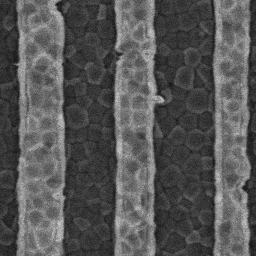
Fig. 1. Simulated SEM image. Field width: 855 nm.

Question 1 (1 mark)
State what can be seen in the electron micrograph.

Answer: one or a few lines or trenches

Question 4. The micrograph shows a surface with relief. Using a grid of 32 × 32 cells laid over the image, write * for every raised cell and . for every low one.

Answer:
..*****........****........****.
..*****........****........****.
..******.......****........****.
..******.......****........****.
...*****.......****........****.
...*****.......****........****.
...*****.......****........****.
...*****.......****........****.
..******.......****........****.
...*****.......****........****.
...****........****........****.
...*****.......****........****.
...*****.......*****.......****.
...*****.......****........****.
...*****.......****........****.
...*****.......****........****.
...*****.......****........****.
...*****.......****........****.
...*****.......****........****.
...*****.......****........****.
...*****.......****........****.
..******.......****........****.
..******.......****........****.
..******.......****........***..
...*****.......****........****.
...*****.......****........****.
...*****.......****........****.
..******.......****........****.
...*****.......****........****.
..******.......****........****.
...****........****........****.
..*****........****........****.